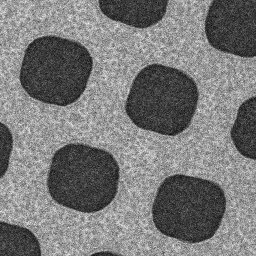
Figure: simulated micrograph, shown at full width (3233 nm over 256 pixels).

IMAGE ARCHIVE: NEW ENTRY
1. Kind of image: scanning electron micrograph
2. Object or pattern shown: holes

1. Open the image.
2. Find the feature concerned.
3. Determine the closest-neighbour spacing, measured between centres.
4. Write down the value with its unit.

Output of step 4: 1.39 micrometres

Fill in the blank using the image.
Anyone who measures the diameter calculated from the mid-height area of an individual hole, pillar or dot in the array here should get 910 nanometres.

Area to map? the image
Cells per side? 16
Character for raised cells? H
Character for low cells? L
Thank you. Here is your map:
HHHHHHLLLLHHHLLL
HHHHHHHHLLHHHLLL
HHLLLHHHHHHHHLLL
HLLLLLHHHHHHHHHL
HLLLLLHHHLLLHHHH
HLLLLHHHLLLLHHHH
HHHLHHHHLLLLHHHL
HHHHHHHHLLLLHHHL
LHHHHHHHHHHHHHLL
LHHHLLLHHHHHHHHL
HHHLLLLHHHHHHHHH
HHHLLLLHHHLLLLHH
HHHLLLLHHHLLLLHH
HHHHHHHHHHLLLLHH
LLHHHHHHHHLLLHHH
LLLHHHHHHHHHHHHH